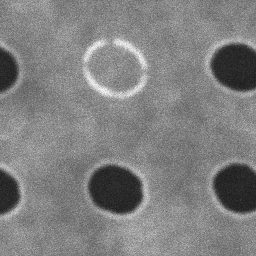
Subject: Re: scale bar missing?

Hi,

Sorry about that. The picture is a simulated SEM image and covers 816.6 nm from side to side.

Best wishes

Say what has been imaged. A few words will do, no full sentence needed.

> holes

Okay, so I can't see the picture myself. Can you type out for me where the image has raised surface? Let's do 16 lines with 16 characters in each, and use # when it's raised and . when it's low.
################
################
################
.############...
.############...
.#############..
################
################
################
################
######..######..
.#####...####...
.#####...#####..
################
################
################